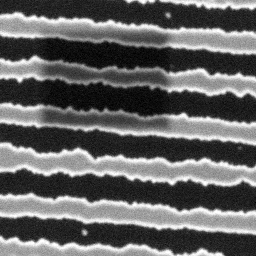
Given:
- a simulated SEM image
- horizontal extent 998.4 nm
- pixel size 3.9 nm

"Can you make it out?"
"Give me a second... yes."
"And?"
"lines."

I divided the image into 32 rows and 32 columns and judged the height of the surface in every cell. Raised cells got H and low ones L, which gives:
LLLLLLLLLLLLLLLLLLLLLLLHHHHHHHHH
LLLLLLLLLLLLLLLLLLLLLLLLLLLLLLLL
HHHHHHHHHHHLLLLLLLLLLLLLLLLLLLLL
HHHHHHHHHHHHHHHHHHHHLLLLLLLLLLLL
LHHHHHHHHHHHHHHHHHHHHHHHHHHHHHHH
LLLLLLLLLLLLLLLHHHHHHHHHHHHHHHHH
LLLLLLLLLLLLLLLLLLLLLLLLLLLLHHHH
HLLLHLLLLLLLLLLLLLLLLLLLLLLLLLLL
HHHHHHHHHHHHLHHLLLLHLLLLLLLLLLLL
HHHHHHHHHHHHHHHHHHHHHHHHHHHHHHLL
LLLLLLLLLLHLLHHHHHHHHHHHHHHHHHHH
LLLLLLLLLLLLLLLLLLLLLLLLLHHHLHHH
LLLLLLLLLLLLLLLLLLLLLLLLLLLLLLLL
HHHHHHHLLLLLLLLLLLLLLLLLLLLLLLLL
HHHHHHHHHHHHHHHHHHLHHHHHLLLLLLLL
LLHHHHHHHHHHHHHHHHHHHHHHHHHHHHHH
LLLLLLLLLLLLLLHHHHHHHHHHHHHHHHHH
LLLLLLLLLLLLLLLLLLLLLLLLLLLHHHHH
HHHLLLLLLLLLLLLLLLLLLLLLLLLLLLLL
HHHHHHHHHHHLLLLLLLLLLLLLLLLLLLLL
HHHHHHHHHHHHHHHHHHHHHHHHHHHHHLLL
LLLLHHHLHHHHHHHHHHHHHHHHHHHHHHHH
LLLLLLLLLLLLLLLLLLLHHHHLHHHHHHHH
LLLLLLLLLLLLLLLLLLLLLLLLLLLLLLLL
HHHHHLLLLLLLLLLLLLLLLLLLLLLLLLLL
HHHHHHHHHHHHHHHHHHLLLLLLLLLLLLLL
HHHHHHHHHHHHHHHHHHHHHHHHHHHHHHLH
LLLLLLLLLLHHHHHHHHHHHHHHHHHHHHHH
LLLLLLLLLLLLLLLLLLLHHHHHHHHHHHHH
LLLLLLLLLLLLLLLLLLLLLLLLLLLLLLLL
HHHHHHHLHLLLLLLLLLLLLLLLLLLLLLLL
HHHHHHHHHHHHHHHHHHHHHLLLLHLLLLLL